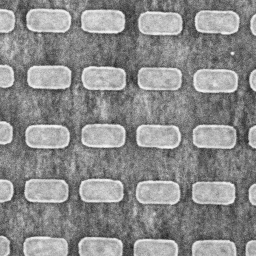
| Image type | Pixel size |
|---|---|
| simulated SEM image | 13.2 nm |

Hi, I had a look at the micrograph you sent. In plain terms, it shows a regular array of raised bodies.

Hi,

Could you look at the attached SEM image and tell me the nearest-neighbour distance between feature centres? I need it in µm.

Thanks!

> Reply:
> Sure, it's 0.725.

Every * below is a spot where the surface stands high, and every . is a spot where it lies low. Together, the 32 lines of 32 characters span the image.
................................
*...****...****..........****...
**.******.*****..******.******.*
**..*****.*****..******..*****.*
................................
................................
................................
................................
*...****...**...................
**..*****.******.******.******.*
*...*****.******.******.******.*
................................
................................
................................
................................
*...............................
*..*****..******.*****..*****..*
*..*****..******.*****..*****..*
................................
................................
................................
................................
....**.....*....................
**.*****..*****..*****..*****..*
*..*****..*****..*****..*****..*
................................
................................
................................
................................
................................
*..*****..*****..*****..*****..*
*..*****..*****..*****..*****..*